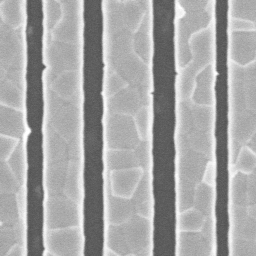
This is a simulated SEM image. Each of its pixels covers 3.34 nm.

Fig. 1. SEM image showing parallel lines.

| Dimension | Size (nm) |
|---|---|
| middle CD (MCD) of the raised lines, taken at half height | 135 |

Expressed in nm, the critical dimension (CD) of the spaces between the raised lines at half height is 62.9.